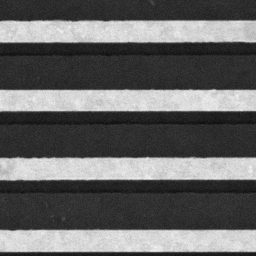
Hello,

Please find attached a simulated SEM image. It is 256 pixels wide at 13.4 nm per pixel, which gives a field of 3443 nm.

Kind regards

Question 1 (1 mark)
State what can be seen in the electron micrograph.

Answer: lines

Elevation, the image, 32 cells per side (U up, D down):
DDDDDDDDDDDDDDDDDDDDDDDDDDDDDDDD
DDDDDDDDDDDDDDDDDDDDDDDDDDDDDDDD
DDDDDDDDDDDDDDDDDDDDDDDDDDDDDDDD
UUUUUUUUUUUUUUUUUUUUUUUUUUUUUUUU
UUUUUUUUUUUUUUUUUUUUUUUUUUUUUUUU
DDDDDDDDDDDDDDDDDDDDDDDDDDDDDDDD
DDDDDDDDDDDDDDDDDDDDDDDDDDDDDDDD
DDDDDDDDDDDDDDDDDDDDDDDDDDDDDDDD
DDDDDDDDDDDDDDDDDDDDDDDDDDDDDDDD
DDDDDDDDDDDDDDDDDDDDDDDDDDDDDDDD
DDDDDDDDDDDDDDDDDDDDDDDDDDDDDDDD
UUUUUUUUUUUUUUUUUUUUUUUUUUUUUUUU
UUUUUUUUUUUUUUUUUUUUUUUUUUUUUUUU
UUUUUUUUUUUUUUUUUUUUUUUUUUUUUUUU
DDDDDDDDDDDDDDDDDDDDDDDDDDDDDDDD
DDDDDDDDDDDDDDDDDDDDDDDDDDDDDDDD
DDDDDDDDDDDDDDDDDDDDDDDDDDDDDDDD
DDDDDDDDDDDDDDDDDDDDDDDDDDDDDDDD
DDDDDDDDDDDDDDDDDDDDDDDDDDDDDDDD
DDDDDDDDDDDDDDDDDDDDDDDDDDDDDDDD
UUUUUUUUUUUUUUUUUUUUUUUUUUUUUUUU
UUUUUUUUUUUUUUUUUUUUUUUUUUUUUUUU
UUDUUUDUDDDDDDDDDDDDDDDDDDDDDDDD
DDDDDDDDDDDDDDDDDDDDDDDDDDDDDDDD
DDDDDDDDDDDDDDDDDDDDDDDDDDDDDDDD
DDDDDDDDDDDDDDDDDDDDDDDDDDDDDDDD
DDDDDDDDDDDDDDDDDDDDDDDDDDDDDDDD
DDDDDDDDDDDDDDDDDDDDDDDDDDDDDDDD
DDDDDDDDDDDDDDDDDDDDDDDDDDDDDDDD
UUUUUUUUUUUUUUUUUUUUUUUUUUUUUUUU
UUUUUUUUUUUUUUUUUUUUUUUUUUUUUUUU
DDDDDDDDDDDDDDDDDDDDDDDDDDDDDDDD